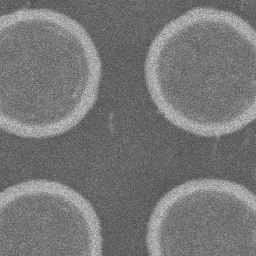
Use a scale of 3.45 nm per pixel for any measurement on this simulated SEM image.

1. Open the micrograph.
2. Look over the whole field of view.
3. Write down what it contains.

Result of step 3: raised bodies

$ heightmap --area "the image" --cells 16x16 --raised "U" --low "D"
DDDDDDDDDDDDDDDD
UUUUDDDDDDDUUUUD
UUUUUDDDDDUUUUUU
UUUUUUDDDDUUUUUU
UUUUUUDDDUUUUUUU
UUUUUUDDDDUUUUUU
UUUUUDDDDDUUUUUU
UUUUUDDDDDDUUUUD
DDDDDDDDDDDDDDDD
DDDDDDDDDDDDDDDD
DDDDDDDDDDDDDDDD
DDDDDDDDDDDDDDDD
UUUUUDDDDDDUUUUU
UUUUUUDDDDUUUUUU
UUUUUUDDDDUUUUUU
UUUUUUDDDDUUUUUU